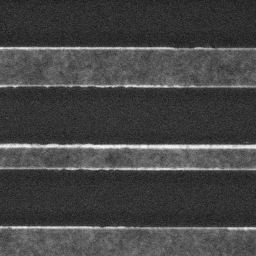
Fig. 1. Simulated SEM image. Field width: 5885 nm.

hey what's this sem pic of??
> lines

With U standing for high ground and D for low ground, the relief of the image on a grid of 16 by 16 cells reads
DDDDDDDDDDDDDDDD
DDDDDDDDDDDDDDDD
DDDDDDDDDDDDDDDD
UUUUUUUUUUUUUUUU
UUUUUUUUUUUUUUUU
DDDDDDDDDDDDDDDD
DDDDDDDDDDDDDDDD
DDDDDDDDDDDDDDDD
DDDDDDDDDDDDDDDD
UUUUUUUUUUUUUUUU
UUUUUUUUUUUUUUUU
DDDDDDDDDDDDDDDD
DDDDDDDDDDDDDDDD
DDDDDDDDDDDDDDDD
UUUUUUUUUUUUUUUU
UUUUUUUUUUUUUUUU